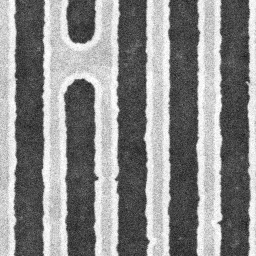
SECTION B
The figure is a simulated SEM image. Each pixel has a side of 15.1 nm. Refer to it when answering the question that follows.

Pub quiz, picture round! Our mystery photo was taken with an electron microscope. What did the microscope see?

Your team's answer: parallel lines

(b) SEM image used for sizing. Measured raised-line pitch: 0.774 µm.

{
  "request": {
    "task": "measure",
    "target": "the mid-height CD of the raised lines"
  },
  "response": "262 nanometers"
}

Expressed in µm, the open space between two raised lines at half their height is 0.513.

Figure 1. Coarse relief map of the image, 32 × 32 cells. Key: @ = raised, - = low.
@@----@@----@@@----@@----@@-----
@@----@@----@@@----@@----@@-----
@@----@@----@@-----@@----@@-----
@@----@@----@@-----@@----@@----@
@@----@@----@@-----@@----@@-----
@@----@@@--@@@-----@@----@@-----
@-----@@@@@@@@-----@@----@@-----
@@----@@@@@@@@-----@@----@@-----
@@----@@@@@@@@-----@@----@@-----
@@----@@@@@@@@-----@@----@@-----
@@----@@----@@-----@@----@@----@
@@----@@----@@-----@@----@@-----
@@----@@----@@-----@@----@@-----
@@----@@----@@@----@@----@@----@
@@----@@----@@-----@@----@@----@
@@----@@----@@-----@@----@@----@
@@----@@----@@@----@@----@@----@
@@----@@----@@-----@@----@@----@
@@----@@----@@-----@@----@@----@
@@----@@----@@-----@@----@@-----
@@----@@----@@-----@@----@@-----
@-----@@----@@-----@@----@@----@
@@----@@-----@-----@@----@@----@
@-----@@----@@-----@@----@@-----
@-----@@----@@-----@@----@@-----
@-----@@----@@-----@@----@@-----
@-----@@----@@-----@@----@@----@
@-----@@----@@-----@@----@@-----
@@----@@----@@-----@@----@@----@
@@----@@----@@-----@@----@@----@
@@----@@----@@-----@@----@@----@
@@----@@----@@-----@@----@@----@